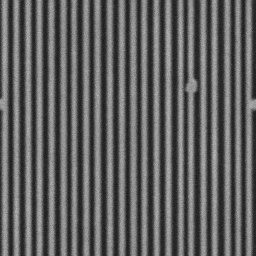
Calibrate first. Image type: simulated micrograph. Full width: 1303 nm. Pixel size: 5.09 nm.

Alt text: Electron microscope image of parallel lines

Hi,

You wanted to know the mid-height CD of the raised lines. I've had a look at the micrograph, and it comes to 25.4 nanometers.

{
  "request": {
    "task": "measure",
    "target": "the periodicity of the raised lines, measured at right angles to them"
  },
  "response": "59 nm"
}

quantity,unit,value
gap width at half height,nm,34.3